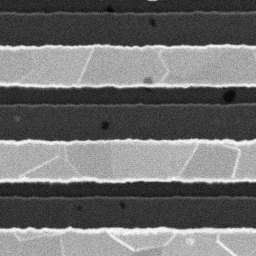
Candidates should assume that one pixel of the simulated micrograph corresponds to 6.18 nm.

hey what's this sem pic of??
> lines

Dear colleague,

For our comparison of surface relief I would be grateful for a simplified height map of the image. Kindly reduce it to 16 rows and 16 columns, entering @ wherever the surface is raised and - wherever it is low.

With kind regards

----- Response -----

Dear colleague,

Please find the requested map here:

----------------
----------------
----------------
@@@@@@@@@@@@@@@@
@@@@@@@@@@@@@@@@
----------------
----------------
----------------
----------------
@@@@@@@@@@@@@@@@
@@@@@@@@@@@@@@@@
----------------
----------------
----------------
@@@@@@@@@@@@@@@@
@@@@@@@@@@@@@@@@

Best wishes